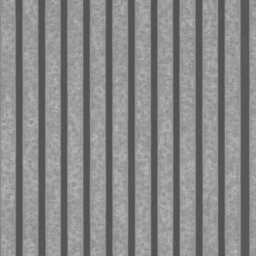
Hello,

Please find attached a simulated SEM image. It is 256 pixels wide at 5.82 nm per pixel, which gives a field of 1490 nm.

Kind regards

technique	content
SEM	parallel lines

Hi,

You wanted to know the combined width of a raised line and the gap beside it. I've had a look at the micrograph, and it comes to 0.131 um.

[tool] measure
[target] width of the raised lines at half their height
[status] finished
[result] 89.4 nanometers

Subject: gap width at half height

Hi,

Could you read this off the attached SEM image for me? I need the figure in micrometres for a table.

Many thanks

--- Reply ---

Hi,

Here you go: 0.04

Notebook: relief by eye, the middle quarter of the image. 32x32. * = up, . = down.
.****.****..****..****..***..***
.****..***..****..****..***..***
.****..***..****..****..***..***
.****..***..****..****..***..***
.****..***..****..****..***..***
.****..***..****..****..***..***
.****..***..****..****..***..***
.****..***..****..****..***..***
.****..***..****..****..***..***
.****..***..****..****..***..***
.****..***..****..****..***..***
.****..***..****..****..***..***
.****..***..****..****..***..***
.****..***..****..****..***..***
.****..***..****..****..***..***
.****..***..****..****..***..***
.****..***..****..****..***..***
.****..***..****..****..***..***
.****..***..****..****..***..***
.****..***..****..****..***..***
.****..***..****..****..***..***
.****..***..****..****..***..***
.****..***..****..****..***..***
.****..***..****..****..***..***
.****..***..****..****..***..***
.****..***..****..****..***..***
.****..***..****..****..***..***
.****..***..****..****..***..***
.****..***..****..****..***..***
.****..***..****..****..***..***
.****..***..****..****..***..***
.****..***..****..****..***..***